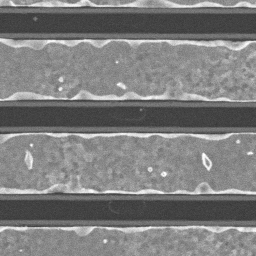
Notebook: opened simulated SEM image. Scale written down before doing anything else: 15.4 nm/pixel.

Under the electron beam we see wiring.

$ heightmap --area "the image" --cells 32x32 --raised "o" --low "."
oooooooooooooooooooooooooooooooo
................................
................................
................................
................................
oooooooooooooooooooooooooooooooo
oooooooooooooooooooooooooooooooo
oooooooooooooooooooooooooooooooo
oooooooooooooooooooooooooooooooo
oooooooooooooooooooooooooooooooo
oooooooooooooooooooooooooooooooo
oooooooooooooooooooooooooooooooo
..........................oooooo
................................
................................
................................
................................
oooooooooooooooooooooooooooooooo
oooooooooooooooooooooooooooooooo
oooooooooooooooooooooooooooooooo
oooooooooooooooooooooooooooooooo
oooooooooooooooooooooooooooooooo
oooooooooooooooooooooooooooooooo
oooooooooooooooooooooooooooooooo
................................
................................
................................
................................
oooooo.ooooooo..oooooooooooooooo
oooooooooooooooooooooooooooooooo
oooooooooooooooooooooooooooooooo
oooooooooooooooooooooooooooooooo